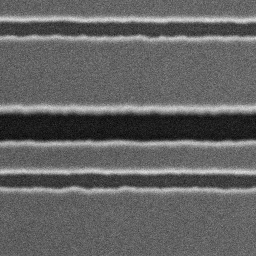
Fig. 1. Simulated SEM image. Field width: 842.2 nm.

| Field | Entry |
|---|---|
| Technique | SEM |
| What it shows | lines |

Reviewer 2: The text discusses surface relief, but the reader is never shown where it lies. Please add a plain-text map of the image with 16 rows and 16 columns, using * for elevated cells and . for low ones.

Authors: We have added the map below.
****************
****************
****************
****************
****************
****************
****************
................
................
****************
****************
****************
****************
****************
****************
****************